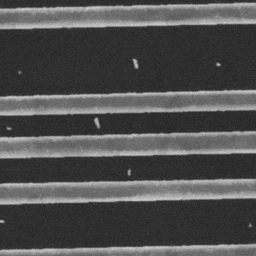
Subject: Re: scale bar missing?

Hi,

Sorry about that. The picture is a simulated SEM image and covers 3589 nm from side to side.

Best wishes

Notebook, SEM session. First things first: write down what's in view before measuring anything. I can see lines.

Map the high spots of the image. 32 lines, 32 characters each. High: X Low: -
--------------------------------
XXXXXXXXXXXXXXXXXXXXXXXXXXXXXXXX
XXXXXXXXXXXXXXXXXXXXXXXXXXXXXXXX
--------------------------------
--------------------------------
--------------------------------
--------------------------------
--------------------------------
--------------------------------
--------------------------------
--------------------------------
---------------------------XXXXX
XXXXXXXXXXXXXXXXXXXXXXXXXXXXXXXX
XXXXXXXXXXXXXXXXXXXXXXXXXXXXXXXX
--------------------------------
--------------------------------
-------------------------------X
XXXXXXXXXXXXXXXXXXXXXXXXXXXXXXXX
XXXXXXXXXXXXXXXXXXXXXXXXXXXXXXXX
--------------------------------
--------------------------------
--------------------------------
--------------------------------
XXXXXXXXXXXXXXXXXXXXXXXXXXXXXXXX
XXXXXXXXXXXXXXXXXXXXXXXXXXXXXXXX
--------------------------------
--------------------------------
--------------------------------
--------------------------------
--------------------------------
--------------------------------
XXXXXXXXXXXXXXXXXXXXXXXXXXXXXXXX